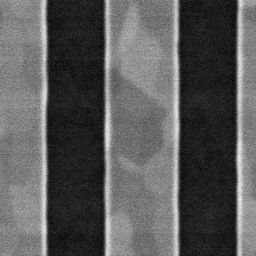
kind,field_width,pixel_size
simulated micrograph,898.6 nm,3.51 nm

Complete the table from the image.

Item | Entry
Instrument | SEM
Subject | wiring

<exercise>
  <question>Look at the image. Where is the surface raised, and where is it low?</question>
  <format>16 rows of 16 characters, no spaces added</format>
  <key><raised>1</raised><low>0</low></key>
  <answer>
1110000111100001
1110000111100001
1110000111100001
1110000111100001
1110000111100001
1110000111100001
1110000111100001
1110000111100001
1110000111100001
1110000111100001
1110000111100001
1110000111100001
1110000111100001
1110000111100001
1110000111100001
1110000111100001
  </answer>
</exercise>